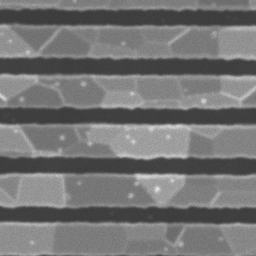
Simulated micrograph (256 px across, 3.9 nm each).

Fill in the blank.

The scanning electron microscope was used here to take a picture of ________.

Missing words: lines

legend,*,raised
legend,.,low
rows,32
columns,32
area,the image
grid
********************************
................................
................................
********************************
********************************
********************************
********************************
................................
................................
*****************************.**
********************************
********************************
********************************
......*..***....*.******.***....
................................
....*...........................
********************************
********************************
********************************
********************************
................................
................................
********************************
********************************
********************************
********************************
................................
................................
********************************
********************************
********************************
********************************